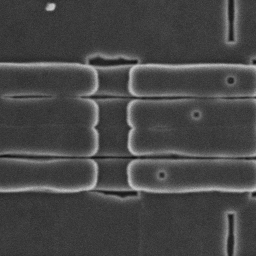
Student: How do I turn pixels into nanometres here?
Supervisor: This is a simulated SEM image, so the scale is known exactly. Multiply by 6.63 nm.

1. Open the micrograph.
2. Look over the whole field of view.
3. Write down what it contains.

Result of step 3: wiring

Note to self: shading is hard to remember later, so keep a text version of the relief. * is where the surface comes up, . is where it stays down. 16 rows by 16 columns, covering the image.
................
................
................
................
******..********
******..********
******..********
******..********
******..********
******..********
******..********
******..********
................
................
................
................